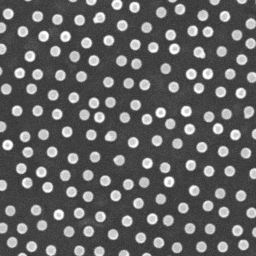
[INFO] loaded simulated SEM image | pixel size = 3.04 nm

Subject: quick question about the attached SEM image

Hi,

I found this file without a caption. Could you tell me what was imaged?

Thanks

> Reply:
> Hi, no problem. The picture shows a regular array of raised bodies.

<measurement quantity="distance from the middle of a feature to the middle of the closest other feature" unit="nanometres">56.8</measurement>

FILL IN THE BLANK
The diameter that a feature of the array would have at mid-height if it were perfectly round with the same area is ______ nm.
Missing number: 29.3